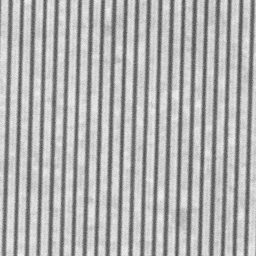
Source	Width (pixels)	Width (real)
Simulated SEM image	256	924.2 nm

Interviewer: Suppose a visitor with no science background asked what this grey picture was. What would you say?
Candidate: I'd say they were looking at parallel lines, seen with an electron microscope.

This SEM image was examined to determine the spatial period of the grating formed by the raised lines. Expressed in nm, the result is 41.6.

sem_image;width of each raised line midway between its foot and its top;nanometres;21.7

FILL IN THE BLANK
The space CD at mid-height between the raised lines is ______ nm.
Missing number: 21.2